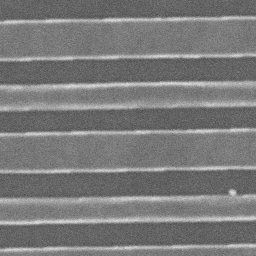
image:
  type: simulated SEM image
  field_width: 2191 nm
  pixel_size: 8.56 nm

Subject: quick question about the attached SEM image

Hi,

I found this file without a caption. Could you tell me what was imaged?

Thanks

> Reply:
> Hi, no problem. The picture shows lines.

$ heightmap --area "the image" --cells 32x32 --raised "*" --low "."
................................
................................
.............*******************
********************************
********************************
********************************
********************************
................................
................................
................................
.................*********......
********************************
********************************
*...............................
................................
................................
..................**************
********************************
********************************
********************************
********************************
................................
................................
................................
................................
********************************
********************************
*****************...............
................................
................................
................................
********************************